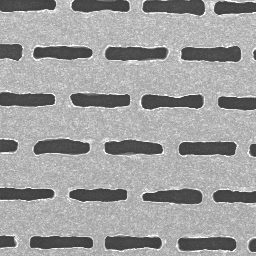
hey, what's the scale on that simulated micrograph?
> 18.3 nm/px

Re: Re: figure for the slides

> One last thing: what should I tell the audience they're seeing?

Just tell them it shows a regular array of holes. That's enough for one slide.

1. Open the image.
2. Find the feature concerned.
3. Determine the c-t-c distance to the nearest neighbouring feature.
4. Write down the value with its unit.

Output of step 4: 1060 nm